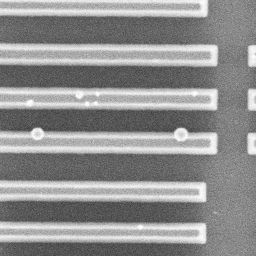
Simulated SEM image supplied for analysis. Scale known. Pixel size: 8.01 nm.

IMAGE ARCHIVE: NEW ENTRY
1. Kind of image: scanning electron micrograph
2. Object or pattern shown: groups of lines, slits or small figures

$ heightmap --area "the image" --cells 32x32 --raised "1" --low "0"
11111111111111111111111111000000
11111111111111111111111111000000
00000000000000000000000000000000
00000000000000000000000000000000
00000000000000000000000000000000
00000000000000000000000000000000
11111111111111111111111111100001
11111111111111111111111111100001
00000000000000000000000000000000
00000000000000000000000000000000
00000000000000000000000000000000
11111111111111111111111111000000
11111111111111111111111111100001
00000000000000000000000000000000
00000000000000000000000000000000
00000000000000000000000000000000
00001100000000000000001000000000
11111111111111111111111111100001
11111111111111111111111111100001
00000000000000000000000000000000
00000000000000000000000000000000
00000000000000000000000000000000
00000000000000000000000000000000
11111111111111111111111110000000
11111111111111111111111110000000
00000000000000000000000000000000
00000000000000000000000000000000
00000000000000000000000000000000
11111111111111111111111110000000
11111111111111111111111110000000
00000000000000000000000000000000
00000000000000000000000000000000